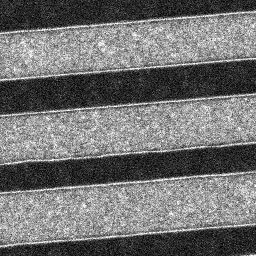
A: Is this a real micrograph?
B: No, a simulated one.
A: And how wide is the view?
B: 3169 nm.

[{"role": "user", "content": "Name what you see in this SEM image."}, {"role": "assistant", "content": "one or a few lines or trenches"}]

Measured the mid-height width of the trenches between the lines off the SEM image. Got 586 nm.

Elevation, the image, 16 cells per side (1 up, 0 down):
1111111111111111
1111111000000000
0000000000000000
0000000000000000
0000001111111111
1111111111111111
1111111110000000
0000000000000000
0000000000000000
0000000001111111
1111111111111111
1111111000000000
0000000000000000
0000000000000000
0000000000111111
1111111111111111